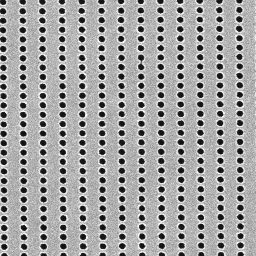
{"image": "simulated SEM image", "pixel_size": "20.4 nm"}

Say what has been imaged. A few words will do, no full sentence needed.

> a regular array of holes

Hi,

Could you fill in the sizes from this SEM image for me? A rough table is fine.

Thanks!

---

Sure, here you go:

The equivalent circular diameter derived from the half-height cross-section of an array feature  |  132 nm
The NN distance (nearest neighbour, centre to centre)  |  0.186 microns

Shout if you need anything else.